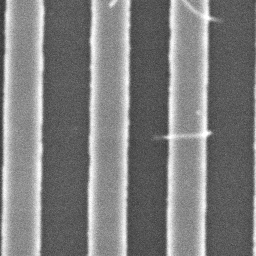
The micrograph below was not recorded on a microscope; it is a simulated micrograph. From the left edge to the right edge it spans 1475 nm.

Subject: lines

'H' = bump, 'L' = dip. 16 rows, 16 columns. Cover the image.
HHHLLLHHLLLHHLLL
HHHLLLHHLLLHHLLL
HHHLLLHHLLLHHLLL
HHHLLLHHLLLHHLLL
HHHLLLHHLLLHHLLL
HHHLLLHHLLLHHLLL
HHHLLLHHLLLHHLLL
HHHLLLHHLLLHHLLL
HHHLLLHHLLLHHLLL
HHHLLLHHLLLHHLLL
HHHLLLHHLLLHHLLL
HHHLLLHHLLLHHLLL
HHHLLLHHLLLHHLLL
HHLLLLHHLLLHHLLL
HHLLLLHHLLLHHLLL
HHLLLLHHLLLHHLLL